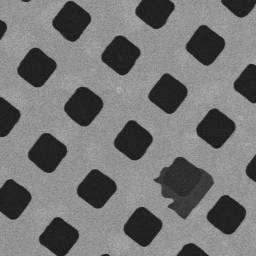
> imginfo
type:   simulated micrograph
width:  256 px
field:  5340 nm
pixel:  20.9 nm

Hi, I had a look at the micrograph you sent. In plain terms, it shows a regular array of holes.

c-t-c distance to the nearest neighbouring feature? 1230 nm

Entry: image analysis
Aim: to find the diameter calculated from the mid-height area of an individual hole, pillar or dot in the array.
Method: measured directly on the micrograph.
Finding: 747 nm